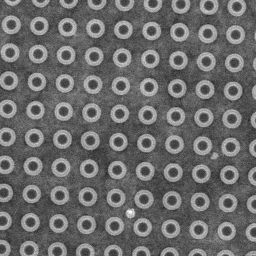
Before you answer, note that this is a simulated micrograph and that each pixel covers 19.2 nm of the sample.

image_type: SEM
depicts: an array of small figures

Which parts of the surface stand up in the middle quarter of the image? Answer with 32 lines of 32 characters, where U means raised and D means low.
DDDDDDDDDDDDDDUDDDDDUUUDDDDUUUDD
DDDDDDDDDDDDDDDDDDDDDDDDDDDDDDDD
DDDDDDDDDDDDDDDDDDDDDDDDDDDDDDDD
UUDDDDUUUDDDDUUDDDDDDDDDDDDDDDDD
UUDDDUUUUDDDUUUUDDDUUUUDDDDUUUDD
UUDDDUUUUDDDUUUUDDDUUUUDDDUUUUDD
UUDDDUUUUDDDUUUUDDDUUUUDDDUUUUDD
DDDDDDDDDDDDDUUDDDDDUUUDDDDUUUDD
DDDDDDDDDDDDDDDDDDDDDDDDDDDDDDDD
DDDDDDDDDDDDDDDDDDDDDDDDDDDDDDDD
UUDDDUUUDDDDDUUDDDDDDDDDDDDDDDDD
UUDDDUUUUDDDUUUUDDDUUUUDDDUUUDDD
UUDDDUUUUDDDUUUUDDDUUUUDDDUUUUDD
UDDDDUUUUDDDUUUUDDDUUUUDDDUUUUDD
DDDDDDDDDDDDDUUDDDDUUUDDDDUUUUDD
DDDDDDDDDDDDDDDDDDDDDDDDDDDDDDDD
DDDDDDDDDDDDDDDDDDDDDDDDDDDDDDDD
UDDDDUUUDDDDDUDDDDDDDDDDDDDDDDDD
UUDDUUUUUDDDUUUUDDDUUUDDDDUUUDDD
UUDDUUUUUDDUUUUUDDUUUUUDDUUUUUDD
UDDDDUUUDDDDUUUUDDUUUUUDDUUUUUDD
DDDDDDDDDDDDDUUDDDDUUUDDDDUUUDDD
DDDDDDDDDDDDDDDDDDDDDDDDDDDDDDDD
DDDDDDDDDDDDDDDDDDDDDDDDDDDDDDDD
UDDDDUUUDDDDUUDDDDDDDDDDDDDDDDDD
UDDDUUUUDDDUUUUDDDDUUUDDDDUUUDDD
UDDDUUUUDDDUUUUDDDUUUUDDDUUUUDDD
UDDDUUUUDDDUUUUDDDUUUUDDDUUUUUDD
DDDDDDDDDDDDUUDDDDDUUUDDDUUUUDDD
DDDDDDDDDDDDDDDDDDDDDDDDDDDDDDDD
DDDDDDDDDDDDDDDDDDDDDDDDDDDDDDDD
UDDDUUUDDDDDUUDDDDDDDDDDDDDDDDDD